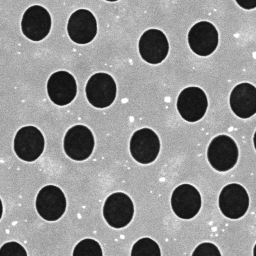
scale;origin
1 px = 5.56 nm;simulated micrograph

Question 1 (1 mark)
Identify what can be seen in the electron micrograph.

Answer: a regular array of holes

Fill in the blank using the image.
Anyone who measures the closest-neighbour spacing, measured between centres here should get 278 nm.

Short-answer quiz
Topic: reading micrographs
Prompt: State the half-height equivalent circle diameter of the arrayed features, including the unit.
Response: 182 nm